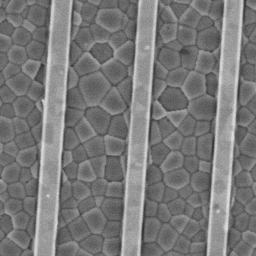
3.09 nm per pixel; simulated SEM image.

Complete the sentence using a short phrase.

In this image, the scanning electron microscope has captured one or a few lines or trenches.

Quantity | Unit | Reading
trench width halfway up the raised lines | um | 0.21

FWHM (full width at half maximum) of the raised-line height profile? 54.3 nm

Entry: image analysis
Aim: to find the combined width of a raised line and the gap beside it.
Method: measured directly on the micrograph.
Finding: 265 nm